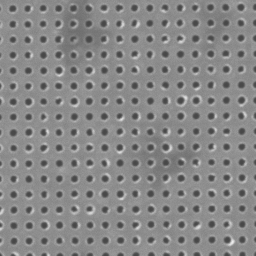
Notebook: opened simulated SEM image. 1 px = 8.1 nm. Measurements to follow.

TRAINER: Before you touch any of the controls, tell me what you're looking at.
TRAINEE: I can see a regular array of holes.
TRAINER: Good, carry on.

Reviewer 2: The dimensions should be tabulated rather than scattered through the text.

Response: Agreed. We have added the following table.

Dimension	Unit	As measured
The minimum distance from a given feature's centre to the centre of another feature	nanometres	121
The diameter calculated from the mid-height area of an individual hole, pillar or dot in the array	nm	56.4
